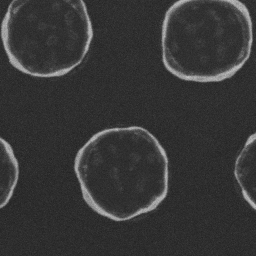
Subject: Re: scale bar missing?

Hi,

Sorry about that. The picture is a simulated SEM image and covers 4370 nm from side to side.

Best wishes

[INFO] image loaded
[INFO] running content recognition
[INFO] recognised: raised bodies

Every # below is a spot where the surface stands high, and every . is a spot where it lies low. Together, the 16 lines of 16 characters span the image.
.####......####.
######....######
######....######
.####.....######
..##.......###..
................
................
................
......####......
#....#####.....#
#....#####.....#
#....#####.....#
......####......
.......#........
................
................